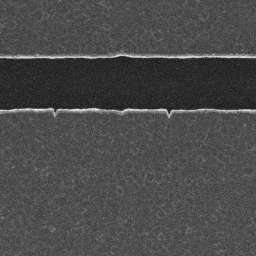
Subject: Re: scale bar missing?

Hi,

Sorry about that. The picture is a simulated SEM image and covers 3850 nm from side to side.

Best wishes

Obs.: one or a few lines or trenches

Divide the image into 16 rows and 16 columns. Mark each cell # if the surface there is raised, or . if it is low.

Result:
################
################
################
################
................
................
................
################
################
################
################
################
################
################
################
################